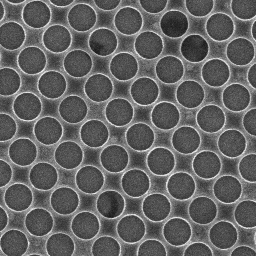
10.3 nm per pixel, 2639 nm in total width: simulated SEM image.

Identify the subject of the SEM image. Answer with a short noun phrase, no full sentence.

a regular array of holes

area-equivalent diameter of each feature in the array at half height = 0.287 microns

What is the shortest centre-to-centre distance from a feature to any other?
0.331 micrometres